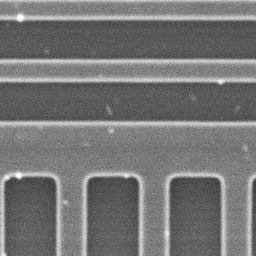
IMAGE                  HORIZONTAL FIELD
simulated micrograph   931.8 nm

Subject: groups of lines, slits or small figures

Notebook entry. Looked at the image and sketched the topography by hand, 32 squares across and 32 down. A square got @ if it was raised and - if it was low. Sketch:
@@@@@@@@@@@@@@@@@@@@@@@@@@@@@@@@
@@@@@@@@@@@@@@@@@@@@@@@@@@@@@@@@
--@-----------------------------
--------------------------------
--------------------------------
--------------------------------
--------------------------------
-@@@@@@@@-------@@@@--@@@@@@@---
@@@@@@@@@@@@@@@@@@@@@@@@@@@@@@@@
@@@@@@@@@@@@@@@@@@@@@@@@@@@@@@@@
--------------------------------
--------------------------------
--------------------------------
--------------------------------
--------------------------------
@@@@@@@@@@@@@@@@@@@@@@@@@@@@@@@@
@@@@@@@@@@@@@@@@@@@@@@@@@@@@@@@@
@@@@@@@@@@@@@@@@@@@@@@@@@@@@@@@@
@@@@@@@@@@@@@@@@@@@@@@@@@@@@@@@@
@@@@@@@@@@@@@@@@@@@@@@@@@@@@@@@@
@@@@@@@@@@@@@@@@@@@@@@@@@@@@@@@@
@@@@@@@@@@@@@@@@@@@@@@@@@@@@@@@@
@------@@@@------@@@@-------@@@@
-------@@@@-------@@@-------@@@-
-------@@@@-------@@@-------@@@-
-------@@@@-------@@@-------@@@-
-------@@@@-------@@@-------@@@-
-------@@@@-------@@@-------@@@-
-------@@@@-------@@@-------@@@-
-------@@@@-------@@@-------@@@-
-------@@@@-------@@@-------@@@-
@------@@@@-------@@@-------@@@-